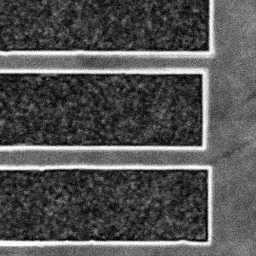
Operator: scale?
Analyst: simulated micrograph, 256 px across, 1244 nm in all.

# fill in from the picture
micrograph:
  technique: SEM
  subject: one or a few lines or trenches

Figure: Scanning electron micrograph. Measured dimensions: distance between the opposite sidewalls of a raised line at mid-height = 0.0971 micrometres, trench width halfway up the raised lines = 74.7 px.